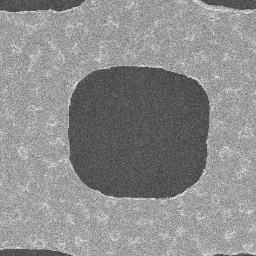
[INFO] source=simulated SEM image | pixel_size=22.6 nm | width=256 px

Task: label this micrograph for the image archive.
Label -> holes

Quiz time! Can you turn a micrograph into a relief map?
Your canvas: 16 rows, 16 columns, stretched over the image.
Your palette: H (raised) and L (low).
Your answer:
LLLLHHHHHHHHHHLL
HHHHHHHHHHHHHHHH
HHHHHHHHHHHHHHHH
HHHHHHHHHHHHHHHH
HHHHHHLLLLLHHHHH
HHHHHLLLLLLLLHHH
HHHHLLLLLLLLLHHH
HHHHLLLLLLLLLHHH
HHHHLLLLLLLLLHHH
HHHHLLLLLLLLLHHH
HHHHHLLLLLLLLHHH
HHHHHLLLLLLLHHHH
HHHHHHHHHHHHHHHH
HHHHHHHHHHHHHHHH
HHHHHHHHHHHHHHHH
HHHHHHHHHHHHHHHH